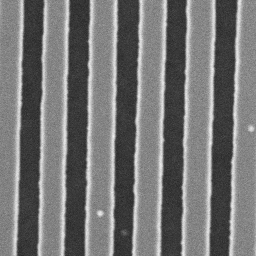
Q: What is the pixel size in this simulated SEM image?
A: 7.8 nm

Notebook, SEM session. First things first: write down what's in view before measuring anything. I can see lines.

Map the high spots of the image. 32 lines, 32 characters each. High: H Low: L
HHHLLLHHHLLHHHHLLHHHHLLHHHHLLLHH
HHHLLHHHHLLHHHHLLHHHHLLHHHHLLLHH
HHHLLHHHHLLHHHHLLHHHHLLHHHHLLLHH
HHHLLHHHLLLHHHHLLHHHHLLHHHHLLLHH
HHHLLHHHLLLHHHHLLHHHHLLHHHHLLLHH
HHHLLHHHLLLHHHHLLHHHHLLHHHHLLHHH
HHHLLHHHLLLHHHHLLHHHHLLHHHHLLHHH
HHHLLHHHLLLHHHHLLHHHHLLHHHHLLHHH
HHHLLHHHLLLHHHHLLHHHHLLHHHHLLHHH
HHHLLHHHLLLHHHHLLHHHLLLHHHHLLHHH
HHHLLHHHLLLHHHLLLHHHLLLHHHHLLHHH
HHHLLHHHLLLHHHLLLHHHLLLHHHHLLHHH
HHHLLHHHLLLHHHLLLHHHLLLHHHHLLHHH
HHHLLHHHLLLHHHLLLHHHLLLHHHHLLHHH
HHHLLHHHLLLHHHLLLHHHLLLHHHHLLHHH
HHHLLHHHLLLHHHLLLHHHLLLHHHHLLHHH
HHLLLHHHLLLHHHLLLHHHLLLHHHLLLHHH
HHLLLHHHLLLHHHLLLHHHLLLHHHLLLHHH
HHLLLHHHLLLHHHLLLHHHLLLHHHLLLHHH
HHLLLHHHLLLHHHLLLHHHLLLHHHLLLHHH
HHLLLHHHLLLHHHLLLHHHLLLHHHLLLHHH
HHLLLHHHLLLHHHLLLHHHLLLHHHLLLHHH
HHLLLHHHLLLHHHLLLHHHLLLHHHLLLHHH
HHLLLHHHLLLHHHLLLHHHLLLHHHLLLHHH
HHLLLHHHLLLHHHLLLHHHLLLHHHLLLHHH
HHLLLHHHLLLHHHLLLHHHLLLHHHLLLHHH
HHLLLHHHLLLHHHLLLHHHLLLHHHLLLHHH
HHLLLHHHLLLHHHLLLHHHLLLHHHLLLHHH
HHLLLHHHLLLHHHLLLHHHLLLHHHLLLHHH
HHLLLHHHLLLHHHLLLHHHLLLHHHLLLHHH
HHLLLHHHLLLHHHLLLHHHLLLHHHLLLHHH
HHLLLHHHLLLHHHLLLHHHLLLHHHLLLHHH